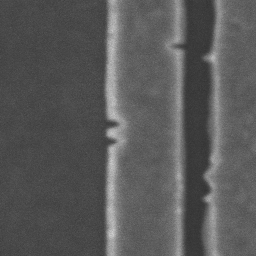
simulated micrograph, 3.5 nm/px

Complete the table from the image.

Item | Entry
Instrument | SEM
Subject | one or a few lines or trenches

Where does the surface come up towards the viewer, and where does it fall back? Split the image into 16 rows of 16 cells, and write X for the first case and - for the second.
-------XXXX--XXX
-------XXXX--XXX
-------XXXX--XXX
-------XXXX--XXX
-------XXXX--XXX
-------XXXX--XXX
-------XXXX--XXX
-------XXXX--XXX
-------XXXX--XXX
-------XXXX--XXX
-------XXXX--XXX
-------XXXX--XXX
-------XXXX--XXX
-------XXXX--XXX
-------XXXX--XXX
-------XXXX--XXX